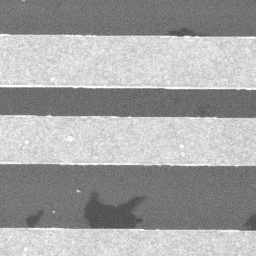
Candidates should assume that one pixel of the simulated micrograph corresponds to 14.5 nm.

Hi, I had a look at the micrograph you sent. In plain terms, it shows lines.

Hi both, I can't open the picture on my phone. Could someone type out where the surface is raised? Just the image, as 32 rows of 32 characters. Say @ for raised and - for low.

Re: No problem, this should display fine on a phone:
--------------------------------
--------------------------------
--------------------------------
--------------------------------
@@@@@@@@@@@@--------------------
@@@@@@@@@@@@@@@@@@@@@@@@@@@@@@@@
@@@@@@@@@@@@@@@@@@@@@@@@@@@@@@@@
@@@@@@@@@@@@@@@@@@@@@@@@@@@@@@@@
@@@@@@@@@@@@@@@@@@@@@@@@@@@@@@@@
@@@@@@@@@@@@@@@@@@@@@@@@@@@@@@@@
@@@@@@@@@@@@@@@@@@@@@@@@@@@@@@@@
--------------------------------
--------------------------------
--------------------------------
--------------------------------
@@@@@@@@@@@@@@@@@@@@@@@@@@@@@@@@
@@@@@@@@@@@@@@@@@@@@@@@@@@@@@@@@
@@@@@@@@@@@@@@@@@@@@@@@@@@@@@@@@
@@@@@@@@@@@@@@@@@@@@@@@@@@@@@@@@
@@@@@@@@@@@@@@@@@@@@@@@@@@@@@@@@
-------@-@@@@@@@@@@@@@@@@@@@@@@@
--------------------------------
--------------------------------
--------------------------------
--------------------------------
--------------------------------
--------------------------------
--------------------------------
--------------------------------
@@@@@@@@@@@@@@@@@@@@@@@@@@@@@@@@
@@@@@@@@@@@@@@@@@@@@@@@@@@@@@@@@
@@@@@@@@@@@@@@@@@@@@@@@@@@@@@@@@